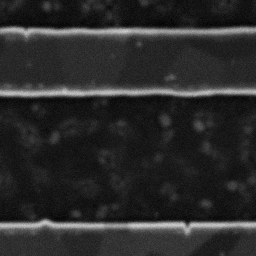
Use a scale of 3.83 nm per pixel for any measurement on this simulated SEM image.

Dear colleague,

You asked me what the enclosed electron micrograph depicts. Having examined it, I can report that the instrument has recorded one or a few lines or trenches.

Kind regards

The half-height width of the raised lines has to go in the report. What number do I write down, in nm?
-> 238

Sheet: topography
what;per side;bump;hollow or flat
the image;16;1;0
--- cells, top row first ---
0000000000000000
0000000000000000
1111111111111111
1111111111111111
1111111111111111
1111111111111111
0000000000000000
0000000000000000
0000000000000000
0000000000000000
0000000000000000
0000000000000000
0000000000000000
0000000000000000
1111111111111111
1111111111111111